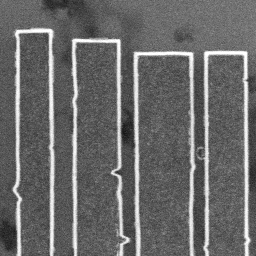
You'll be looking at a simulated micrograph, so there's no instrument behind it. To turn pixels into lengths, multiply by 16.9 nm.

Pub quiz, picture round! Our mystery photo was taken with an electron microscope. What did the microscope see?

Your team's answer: one or a few lines or trenches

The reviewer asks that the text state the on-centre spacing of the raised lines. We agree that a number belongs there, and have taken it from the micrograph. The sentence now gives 1080 nm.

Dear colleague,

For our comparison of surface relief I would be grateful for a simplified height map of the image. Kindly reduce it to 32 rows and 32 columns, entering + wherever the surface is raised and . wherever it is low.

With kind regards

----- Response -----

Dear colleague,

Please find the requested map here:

................................
................................
................................
................................
..++++..........................
..++++...++++++.................
..++++...++++++.................
..++++...++++++..+++++++..+++++.
..++++...++++++..+++++++..+++++.
..++++...++++++..+++++++..+++++.
..++++...++++++..+++++++..+++++.
..++++...++++++..+++++++..+++++.
..++++...++++++..+++++++..+++++.
..++++...++++++..+++++++..+++++.
..++++...++++++..+++++++..+++++.
..++++...++++++..+++++++..+++++.
..++++...++++++..+++++++..+++++.
..++++...++++++..+++++++..+++++.
..++++...++++++..+++++++..+++++.
..++++...++++++..+++++++..+++++.
..++++...++++++..+++++++..+++++.
..++++...++++++..+++++++..+++++.
..++++...++++++..+++++++..+++++.
..++++...++++++..+++++++..+++++.
..++++...++++++..+++++++..+++++.
..++++...++++++..+++++++..+++++.
..++++...++++++..+++++++..+++++.
..+++++..++++++..+++++++..+++++.
..++++...++++++..+++++++..+++++.
..++++...++++++..+++++++..+++++.
..++++...++++++..+++++++..+++++.
..++++...++++++..+++++++..+++++.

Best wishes